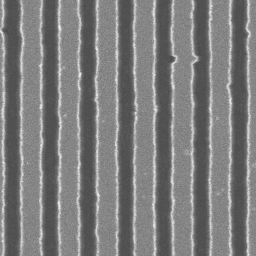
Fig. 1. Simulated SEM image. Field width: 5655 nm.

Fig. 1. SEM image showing parallel lines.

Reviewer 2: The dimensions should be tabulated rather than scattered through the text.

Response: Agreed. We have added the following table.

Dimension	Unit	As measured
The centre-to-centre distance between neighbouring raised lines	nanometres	835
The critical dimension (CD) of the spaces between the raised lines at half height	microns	0.306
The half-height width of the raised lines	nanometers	522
